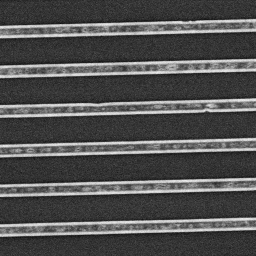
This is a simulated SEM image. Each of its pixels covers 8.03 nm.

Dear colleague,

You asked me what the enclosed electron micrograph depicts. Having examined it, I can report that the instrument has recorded parallel lines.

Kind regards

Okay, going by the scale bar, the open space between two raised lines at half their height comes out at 240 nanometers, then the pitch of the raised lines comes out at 319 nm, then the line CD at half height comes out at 80.2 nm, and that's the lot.